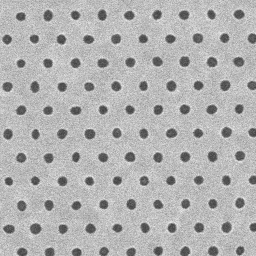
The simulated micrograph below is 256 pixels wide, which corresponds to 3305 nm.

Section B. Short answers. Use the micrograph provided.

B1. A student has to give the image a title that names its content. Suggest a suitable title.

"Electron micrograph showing a regular array of holes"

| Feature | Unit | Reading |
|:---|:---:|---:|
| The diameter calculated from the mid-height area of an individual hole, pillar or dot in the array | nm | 134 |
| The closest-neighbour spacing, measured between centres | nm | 346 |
